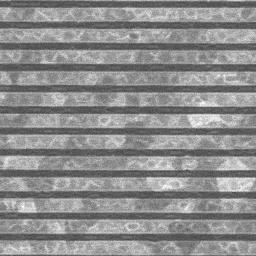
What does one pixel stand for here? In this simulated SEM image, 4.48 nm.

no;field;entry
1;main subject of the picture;parallel lines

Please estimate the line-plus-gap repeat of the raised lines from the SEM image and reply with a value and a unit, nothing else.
0.0949 um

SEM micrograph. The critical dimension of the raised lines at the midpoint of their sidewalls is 58.2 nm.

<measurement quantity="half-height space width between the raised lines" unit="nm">37.5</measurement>